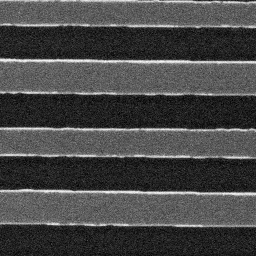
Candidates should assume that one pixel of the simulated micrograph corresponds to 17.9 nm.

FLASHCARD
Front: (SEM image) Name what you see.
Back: lines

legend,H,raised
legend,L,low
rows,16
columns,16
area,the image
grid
HHHHHHHHHHHHHHHH
HHHHHHHHHHHHHHHH
LLLLLLLLLLLLLLLL
LLLLLLLLLLLLLLLL
HHHHHHHHHHHHHHHH
HHHHHHHHHHHHHHHH
LLLLLLLLLLLLLLLL
LLLLLLLLLLLLLLLL
HHHHHHHHHHHHHHHH
HHHHHHHHHHHHHHHH
LLLLLLLLLLLLLLLL
LLLLLLLLLLLLLLLL
HHHHHHHHHHHHHHHH
HHHHHHHHHHHHHHHH
LLLLLLLLLLLLLLLL
LLLLLLLLLLLLLLLL